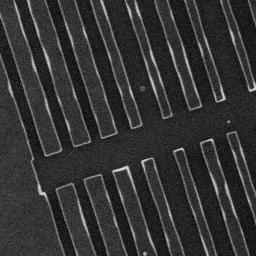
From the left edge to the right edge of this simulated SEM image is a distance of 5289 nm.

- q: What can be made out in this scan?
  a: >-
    groups of lines, slits or small figures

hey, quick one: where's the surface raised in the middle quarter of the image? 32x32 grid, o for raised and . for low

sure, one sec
o...oooo....ooo......oo.....ooo.
o...oooo....ooo......oo.....ooo.
o...ooooo....oo......ooo.....ooo
o....oooo....ooo......oo.....ooo
oo...oooo....ooo......oo.....ooo
oo...ooooo...ooo......ooo.....oo
oo....oooo....ooo......oo.....oo
ooo...oooo....ooo......oo.....oo
ooo...oooo....ooo......ooo....oo
ooo...ooooo....ooo......oo.....o
oooo...oooo....ooo......oo.....o
oooo...oooo....ooo......ooo.....
ooooo...oooo....ooo......oo.....
ooooo...oooo....ooo......o......
.oooo...oooo....ooo.............
.oooo....oooo....oo.............
.ooooo...oooo...................
.ooooo...oooo...................
..oooo..........................
..oooo..........................
..oo............................
............................oo..
............................oo..
.....................o......ooo.
....................ooo.....ooo.
....................ooo......oo.
..............oo....ooo......oo.
............oooo....ooo......ooo
......oooo...oooo....ooo......oo
.....ooooo...oooo....ooo......oo
oo...ooooo...oooo....ooo......oo
ooo...oooo....oooo....ooo.....oo